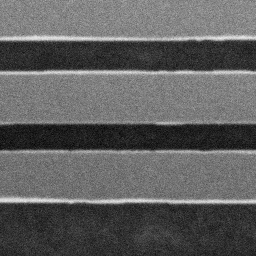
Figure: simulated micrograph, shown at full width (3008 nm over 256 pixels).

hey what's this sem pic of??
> lines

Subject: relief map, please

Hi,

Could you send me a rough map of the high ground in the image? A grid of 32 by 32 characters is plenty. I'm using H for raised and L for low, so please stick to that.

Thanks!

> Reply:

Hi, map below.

HHHHHHHHHHHHHHHHHHHHHHHHHHHHHHHH
HHHHHHHHHHHHHHHHHHHHHHHHHHHHHHHH
HHHHHHHHHHHHHHHHHHHHHHHHHHHHHHHH
HHHHHHHHHHHHHHHHHHHHHHHHHHHHHHHH
HHHHHHHHHHHHHHHHHHHHHHHHHHHHHHHH
LLLLLLLLLLLLLLLLLLLLLLLLLLLLLLLL
LLLLLLLLLLLLLLLLLLLLLLLLLLLLLLLL
LLLLLLLLLLLLLLLLLLLLLLLLLLLLLLLL
LLLLLLLLLLLLLLLLLLLLLLLLLLLLLLLL
HHHHHHHHHHHHHHHHHHHHHHHHHHHHHHHH
HHHHHHHHHHHHHHHHHHHHHHHHHHHHHHHH
HHHHHHHHHHHHHHHHHHHHHHHHHHHHHHHH
HHHHHHHHHHHHHHHHHHHHHHHHHHHHHHHH
HHHHHHHHHHHHHHHHHHHHHHHHHHHHHHHH
HHHHHHHHHHHHHHHHHHHHHHHHHHHHHHHH
LLLLLLLLLLLLLLLLLLLLLLLLLLLLLLLL
LLLLLLLLLLLLLLLLLLLLLLLLLLLLLLLL
LLLLLLLLLLLLLLLLLLLLLLLLLLLLLLLL
LLLLLLLLLLLLLLLLLLLLLLLLLLLLLLLL
HHHHHHHHHHHHHHHHHHHHHHHHHHHHHHHH
HHHHHHHHHHHHHHHHHHHHHHHHHHHHHHHH
HHHHHHHHHHHHHHHHHHHHHHHHHHHHHHHH
HHHHHHHHHHHHHHHHHHHHHHHHHHHHHHHH
HHHHHHHHHHHHHHHHHHHHHHHHHHHHHHHH
HHHHHHHHHHHHHHHHHHHHHHHHHHHHHHHH
LLLLLLLLLLLLLLLLLLLLLLLLLLLLLLLL
LLLLLLLLLLLLLLLLLLLLLLLLLLLLLLLL
LLLLLLLLLLLLLLLLLLLLLLLLLLLLLLLL
LLLLLLLLLLLLLLLLLLLLLLLLLLLLLLLL
LLLLLLLLLLLLLLLLLLLLLLLLLLLLLLLL
LLLLLLLLLLLLLLLLLLLLLLLLLLLLLLLL
LLLLLLLLLLLLLLLLLLLLLLLLLLLLLLLL